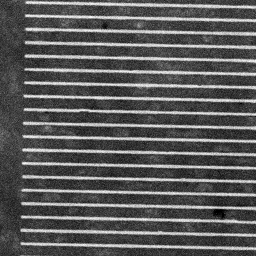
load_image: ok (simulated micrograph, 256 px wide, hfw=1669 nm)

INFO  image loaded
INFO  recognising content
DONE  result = parallel lines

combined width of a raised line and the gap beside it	0.0875	µm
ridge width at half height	12.2	nm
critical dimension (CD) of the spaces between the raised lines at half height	73.4	nm